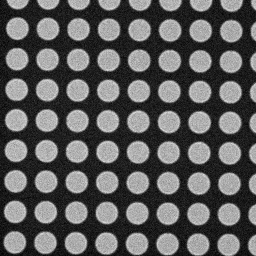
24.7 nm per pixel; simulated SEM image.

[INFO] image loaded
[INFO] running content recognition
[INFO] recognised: an array of small figures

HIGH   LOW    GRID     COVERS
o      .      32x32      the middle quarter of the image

.ooooo...oooo...ooooo...ooooo...
..ooo.....oo......oo.....ooo....
................................
................................
..ooo.....ooo....ooo.....oo.....
.ooooo...oooo...ooooo...ooooo...
.ooooo...ooooo..ooooo...ooooo..o
.ooooo...ooooo..ooooo...ooooo..o
..ooo....oooo....oooo...ooooo...
................................
................................
................................
.oooo....oooo....ooo.....ooo....
.ooooo..oooooo..ooooo...ooooo..o
.ooooo..ooooo...ooooo...ooooo..o
.ooooo...oooo...ooooo...ooooo..o
..ooo....oooo....ooo....oooo....
................................
................................
..oo......oo......o.............
.ooooo...oooo...ooooo...oooo....
.ooooo..ooooo...ooooo...ooooo..o
.ooooo..ooooo...ooooo...ooooo..o
.oooo....oooo...ooooo...oooo...o
..oo......oo......oo.....oo.....
................................
................................
..ooo....ooo.....ooo.....oo.....
.ooooo..ooooo...ooooo...oooo....
.ooooo..ooooo...ooooo..oooooo..o
.ooooo..ooooo...ooooo..oooooo..o
.oooo....oooo....ooo....oooo....